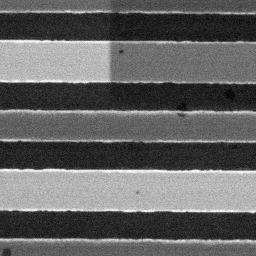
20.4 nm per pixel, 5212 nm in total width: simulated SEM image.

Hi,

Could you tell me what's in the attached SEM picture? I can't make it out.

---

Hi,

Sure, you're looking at lines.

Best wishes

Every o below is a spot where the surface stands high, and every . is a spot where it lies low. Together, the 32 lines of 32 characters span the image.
oooooooooooooooooooooooooooooooo
....................o..ooooooooo
................................
................................
................................
oooooooooooooooooooooooooooooooo
oooooooooooooooooooooooooooooooo
oooooooooooooooooooooooooooooooo
oooooooooooooooooooooooooooooooo
oooooooooooooooooooooooooooooooo
................................
................................
................................
................................
oooooooooooooooooooooooooooooooo
oooooooooooooooooooooooooooooooo
oooooooooooooooooooooooooooooooo
.....o...ooooooooooooooooooooooo
................................
................................
................................
oooooooooooooooooooooooooooooooo
oooooooooooooooooooooooooooooooo
oooooooooooooooooooooooooooooooo
oooooooooooooooooooooooooooooooo
oooooooooooooooooooooooooooooooo
...............................o
................................
................................
................................
oooooooooooooooooooooooooooooooo
oooooooooooooooooooooooooooooooo